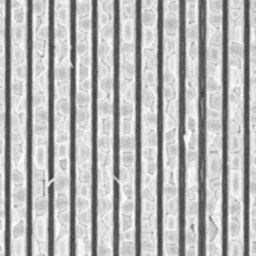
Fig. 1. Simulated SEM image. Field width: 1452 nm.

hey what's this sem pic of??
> parallel lines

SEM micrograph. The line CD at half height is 0.0935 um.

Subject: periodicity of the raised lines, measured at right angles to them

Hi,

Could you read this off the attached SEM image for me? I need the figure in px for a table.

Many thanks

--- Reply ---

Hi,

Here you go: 21.7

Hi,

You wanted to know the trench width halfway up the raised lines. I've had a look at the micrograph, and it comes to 31.2 nanometres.